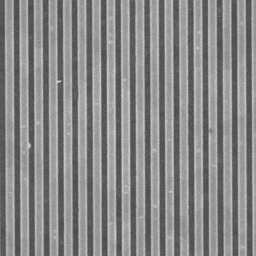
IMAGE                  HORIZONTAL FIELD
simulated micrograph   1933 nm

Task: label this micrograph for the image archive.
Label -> parallel lines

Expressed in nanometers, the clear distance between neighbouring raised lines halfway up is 50.9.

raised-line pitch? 110 nm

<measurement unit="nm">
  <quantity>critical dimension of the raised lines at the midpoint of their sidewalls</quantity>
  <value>56.6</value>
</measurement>